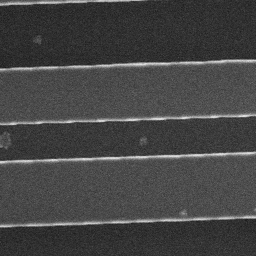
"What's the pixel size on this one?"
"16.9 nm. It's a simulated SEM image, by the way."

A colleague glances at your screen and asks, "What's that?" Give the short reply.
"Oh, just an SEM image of lines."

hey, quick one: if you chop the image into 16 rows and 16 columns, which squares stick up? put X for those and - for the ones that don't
----------------
----------------
----------------
----------------
XXXXXXXXXXXXXXXX
XXXXXXXXXXXXXXXX
XXXXXXXXXXXXXXXX
XXXXXXXXXXXXXXXX
XXXXXXXXXXXXXXXX
XXXXXXXXXXXXXXXX
XXXXXXXXXXXXXXXX
XXXXXXXXXXXXXXXX
XXXXXXXXXXXXXXXX
XXXXXXXXXXXXXXXX
----------------
----------------